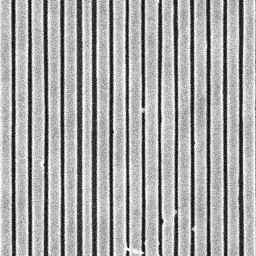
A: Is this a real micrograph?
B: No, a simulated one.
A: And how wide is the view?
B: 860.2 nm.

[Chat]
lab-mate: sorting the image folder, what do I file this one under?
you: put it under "parallel lines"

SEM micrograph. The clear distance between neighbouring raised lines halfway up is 16.8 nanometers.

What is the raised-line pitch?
54.7 nm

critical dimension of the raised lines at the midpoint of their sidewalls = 11.8 pixels